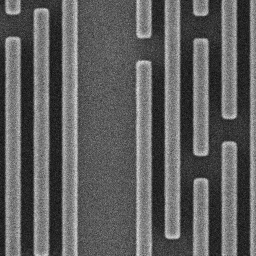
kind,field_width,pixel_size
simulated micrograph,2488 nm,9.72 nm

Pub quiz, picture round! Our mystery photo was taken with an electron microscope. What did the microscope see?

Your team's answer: groups of lines, slits or small figures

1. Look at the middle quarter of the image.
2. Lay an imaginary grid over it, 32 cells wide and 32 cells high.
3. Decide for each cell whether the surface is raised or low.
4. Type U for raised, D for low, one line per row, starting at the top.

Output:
UUUDDDDDDDDDDDDDDDUUUUDDDUUUUDDD
UUUDDDDDDDDDDDDDDDUUUUDDDUUUUDDD
UUUDDDDDDDDDDDDDDDUUUUDDDUUUUDDD
UUUDDDDDDDDDDDDDDDUUUUDDDUUUUDDD
UUUDDDDDDDDDDDDDDDUUUUDDDUUUUDDD
UUUDDDDDDDDDDDDDDDUUUUDDDUUUUDDD
UUUDDDDDDDDDDDDDDDUUUUDDDUUUUDDD
UUUDDDDDDDDDDDDDDDUUUUDDDUUUUDDD
UUUDDDDDDDDDDDDDDDUUUUDDDUUUUDDD
UUUDDDDDDDDDDDDDDDUUUUDDDUUUUDDD
UUUDDDDDDDDDDDDDDDUUUUDDDUUUUDDD
UUUDDDDDDDDDDDDDDDUUUUDDDUUUUDDD
UUUDDDDDDDDDDDDDDDUUUUDDDUUUUDDD
UUUDDDDDDDDDDDDDDDUUUUDDDUUUUDDD
UUUDDDDDDDDDDDDDDDUUUUDDDUUUUDDD
UUUDDDDDDDDDDDDDDDUUUUDDDUUUUDDD
UUUDDDDDDDDDDDDDDDUUUUDDDUUUUDDD
UUUDDDDDDDDDDDDDDDUUUUDDDUUUUDDD
UUUDDDDDDDDDDDDDDDUUUUDDDUUUUDDD
UUUDDDDDDDDDDDDDDDUUUUDDDUUUUDDD
UUUDDDDDDDDDDDDDDDUUUUDDDUUUUDDD
UUUDDDDDDDDDDDDDDDUUUUDDDUUUUDDD
UUUDDDDDDDDDDDDDDDUUUUDDDUUUUDDD
UUUDDDDDDDDDDDDDDDUUUUDDDUUUUDDD
UUUDDDDDDDDDDDDDDDUUUUDDDUUUUDDD
UUUDDDDDDDDDDDDDDDUUUUDDDUUUUDDD
UUUDDDDDDDDDDDDDDDUUUUDDDUUUUDDD
UUUDDDDDDDDDDDDDDDUUUUDDDUUUUDDD
UUUDDDDDDDDDDDDDDDUUUUDDDUUUUDDD
UUUDDDDDDDDDDDDDDDUUUUDDDUUUUDDD
UUUDDDDDDDDDDDDDDDUUUUDDDUUUUDDD
UUUDDDDDDDDDDDDDDDUUUUDDDUUUUDDD